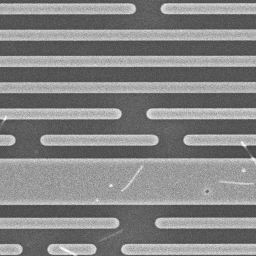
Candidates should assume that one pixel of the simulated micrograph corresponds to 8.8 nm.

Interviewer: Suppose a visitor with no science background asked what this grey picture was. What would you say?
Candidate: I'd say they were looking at groups of lines, slits or small figures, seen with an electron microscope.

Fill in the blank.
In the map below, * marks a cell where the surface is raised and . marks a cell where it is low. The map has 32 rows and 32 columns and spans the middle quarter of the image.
********************************
................................
................................
................................
................................
********************************
********************************
................................
................................
................................
................................
**************.......***********
**************.......***********
**************.......***********
................................
................................
................................
................................
***********************.......**
***********************.......**
................................
................................
................................
................................
********************************
********************************
********************************
********************************
********************************
********************************
********************************
********************************